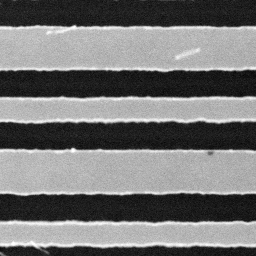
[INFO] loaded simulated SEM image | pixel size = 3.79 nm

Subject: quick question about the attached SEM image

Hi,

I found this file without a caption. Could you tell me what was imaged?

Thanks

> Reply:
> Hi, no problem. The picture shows lines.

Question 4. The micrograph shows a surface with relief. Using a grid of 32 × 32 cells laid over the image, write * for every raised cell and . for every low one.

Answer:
................................
................................
................................
********************************
********************************
********************************
********************************
********************************
********************************
................................
................................
................................
********************************
********************************
********************************
................................
................................
................................
................................
********************************
********************************
********************************
********************************
********************************
................................
................................
................................
................................
********************************
********************************
********************************
................................